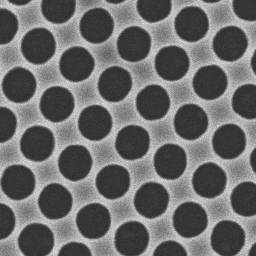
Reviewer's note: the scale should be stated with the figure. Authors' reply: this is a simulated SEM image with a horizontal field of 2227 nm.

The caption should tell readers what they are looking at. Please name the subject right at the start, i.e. a regular array of holes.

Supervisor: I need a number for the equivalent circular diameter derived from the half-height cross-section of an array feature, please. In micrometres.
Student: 0.309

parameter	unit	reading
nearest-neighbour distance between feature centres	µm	0.369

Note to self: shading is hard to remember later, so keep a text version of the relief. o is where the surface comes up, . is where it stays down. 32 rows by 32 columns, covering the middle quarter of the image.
........oooo..ooooooooo........o
.......ooo......ooooooo........o
.......oo........oooooo.......oo
......ooo........ooooooo.....ooo
oo.ooooo.........ooooooooooooooo
oooooooo.........oooo...oooooooo
.oooooooo........oo......ooooooo
..ooooooo.......oo........oooooo
..oooooooo.....ooo........oooooo
...oooooooo..ooooo.........ooooo
...ooo....oooooooo.........oo...
..ooo......ooooooo........oo....
..oo.......oooooooo.......oo....
.ooo........oooooooo.....ooo....
ooo.........ooooooooooooooo.....
ooo.........ooo....oooooooo.....
oooo........oo......oooooooo....
oooo.......oo........ooooooo....
ooooo.....ooo.........ooooooo...
ooooooooooooo.........oooooooooo
o....oooooooo........ooo.....ooo
......ooooooo........oo.......oo
.......ooooooo.......oo.......oo
.......ooooooo.....ooo.........o
.......ooooooooooooooo.........o
.......oooo...oooooooo.........o
.......oo.......ooooooo.......oo
......oo........ooooooo.......oo
.....ooo.........ooooooo.....ooo
oooooooo.........oooo.oooooooooo
oooooooo.........oo......ooooooo
.ooooooo........oo........oooooo